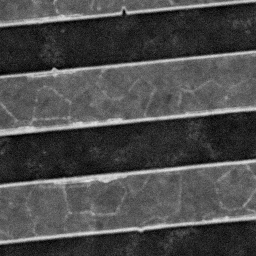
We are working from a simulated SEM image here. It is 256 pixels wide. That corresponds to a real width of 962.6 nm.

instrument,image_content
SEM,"one or a few lines or trenches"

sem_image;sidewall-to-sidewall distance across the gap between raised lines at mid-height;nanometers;196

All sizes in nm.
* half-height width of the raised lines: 212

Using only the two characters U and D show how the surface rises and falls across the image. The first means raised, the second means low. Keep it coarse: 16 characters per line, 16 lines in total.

UUUUUUUUUUUDDDDD
UDDDDDDDDDDDDDDD
DDDDDDDDDDDDDDDD
DDDDDDDDDDDDDDUU
DDDUUUUUUUUUUUUU
UUUUUUUUUUUUUUUU
UUUUUUUUUUUUUUUU
UUUUUUUUUDDDDDDD
DDDDDDDDDDDDDDDD
DDDDDDDDDDDDDDDD
DDDDDDDDDDDDUUUU
DUUUUUUUUUUUUUUU
UUUUUUUUUUUUUUUU
UUUUUUUUUUUUUUUU
UUUUUUDDDDDDDDDD
DDDDDDDDDDDDDDDD